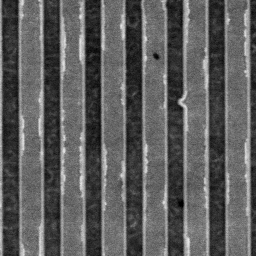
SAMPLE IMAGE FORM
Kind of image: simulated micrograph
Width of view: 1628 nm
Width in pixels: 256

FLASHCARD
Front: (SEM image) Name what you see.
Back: parallel lines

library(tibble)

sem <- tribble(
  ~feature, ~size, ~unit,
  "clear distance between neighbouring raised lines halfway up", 114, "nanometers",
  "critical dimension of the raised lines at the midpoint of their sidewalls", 146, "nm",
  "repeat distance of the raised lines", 262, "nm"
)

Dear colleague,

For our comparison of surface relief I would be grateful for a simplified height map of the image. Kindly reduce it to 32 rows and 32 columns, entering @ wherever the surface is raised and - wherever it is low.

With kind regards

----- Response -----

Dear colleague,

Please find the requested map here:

--@@@---@@---@@---@@@--@@@--@@@-
--@@@---@@---@@---@@@--@@@--@@@-
--@@@---@@---@@@--@@@--@@@--@@@-
---@@---@@---@@@--@@@--@@@--@@@-
---@@---@@---@@@--@@@--@@@--@@@-
---@@---@@---@@@--@@@--@@@--@@@-
---@@---@@---@@@--@@@--@@@--@@@-
---@@---@@---@@@--@@@--@@@--@@@-
---@@---@@---@@@--@@@--@@@--@@@-
---@@---@@---@@@--@@@--@@@--@@@-
---@@---@@---@@@--@@@--@@@--@@@-
---@@---@@---@@@--@@@--@@@--@@@-
---@@---@@---@@@--@@@--@@@--@@@-
---@@---@@---@@@--@@@--@@@--@@@-
---@@---@@---@@@--@@@--@@@--@@@-
---@@---@@---@@@--@@@--@@@--@@@-
---@@---@@---@@@--@@@--@@@--@@@-
---@@---@@---@@@--@@@--@@@--@@@-
---@@---@@---@@@--@@@--@@@--@@@-
---@@---@@---@@@--@@@--@@@--@@@-
---@@---@@---@@@--@@@--@@@--@@@-
---@@---@@---@@@--@@@--@@@--@@@-
---@@---@@---@@@--@@@--@@@--@@@-
---@@---@@---@@@--@@@--@@@--@@@-
---@@---@@---@@@--@@@--@@@--@@@-
---@@---@@---@@@--@@@--@@@--@@@-
---@@---@@---@@@--@@@--@@@--@@@-
---@@---@@---@@@--@@@--@@@--@@@-
---@@---@@---@@@--@@@--@@@--@@@-
---@@---@@---@@@--@@@--@@@--@@@-
---@@---@@---@@@--@@@--@@@--@@@-
---@@---@@---@@@--@@@--@@@--@@@-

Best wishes